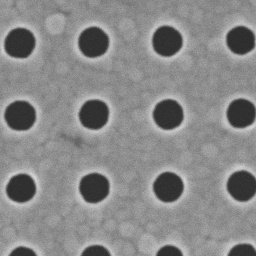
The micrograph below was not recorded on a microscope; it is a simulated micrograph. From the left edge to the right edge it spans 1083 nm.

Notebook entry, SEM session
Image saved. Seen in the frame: a regular array of holes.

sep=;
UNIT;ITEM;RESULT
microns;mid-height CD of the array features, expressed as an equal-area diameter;0.13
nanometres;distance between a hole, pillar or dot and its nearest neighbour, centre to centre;307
